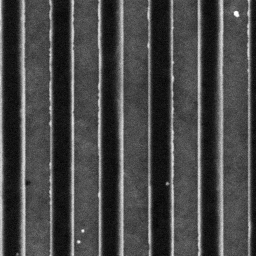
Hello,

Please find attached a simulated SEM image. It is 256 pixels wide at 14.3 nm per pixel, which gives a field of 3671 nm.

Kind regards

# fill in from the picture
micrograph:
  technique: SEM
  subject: lines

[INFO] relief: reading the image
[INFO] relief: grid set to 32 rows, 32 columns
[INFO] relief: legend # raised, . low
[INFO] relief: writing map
###...###...###....###...###...#
###...###...###....###...###...#
###...###...###....###...###...#
###...###...###....###...###...#
###...###...###....###...###...#
###...###...###....###...###...#
###...###...###....###...###...#
###...###...###....###...###...#
###...###...###....###...###...#
###...###...###....###...###...#
###...###...###....###...###...#
###...###...###....###...###...#
###...###...###....###...###...#
###...###...###....###...###...#
###...###...###....###...##....#
###...###...###....###...##....#
###...###...###....###...###...#
###...###...###....###...###...#
###...###...###....###...###...#
###...###...###....###...###...#
###...###...###....###...###...#
###...###...###....###...###...#
###...###...###....###...###...#
###...###...###....###...###...#
###...###...###....###...###...#
###...###...###....###...###...#
###...###...###....###...###...#
###...###...###....###...###...#
###...###...###....###...###...#
###...###...###....###...###...#
###...###...###....###...###...#
###...###...###....###...###...#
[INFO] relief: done